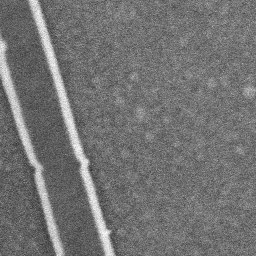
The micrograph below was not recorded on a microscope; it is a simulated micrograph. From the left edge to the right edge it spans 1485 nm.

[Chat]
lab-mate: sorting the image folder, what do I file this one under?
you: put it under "one or a few lines or trenches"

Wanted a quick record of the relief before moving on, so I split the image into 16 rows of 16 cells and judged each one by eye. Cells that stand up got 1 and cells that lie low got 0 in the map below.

1100000000000000
1110000000000000
1110000000000000
1110000000000000
1110000000000000
0111000000000000
0111000000000000
0111000000000000
0011100000000000
0011100000000000
0011100000000000
0001110000000000
0001110000000000
0001110000000000
0001110000000000
0000111000000000